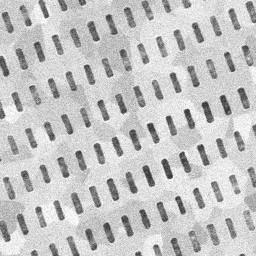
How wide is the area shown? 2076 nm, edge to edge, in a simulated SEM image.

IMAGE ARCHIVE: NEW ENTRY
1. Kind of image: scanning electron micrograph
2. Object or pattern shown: a regular array of holes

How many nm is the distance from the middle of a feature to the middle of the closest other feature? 155